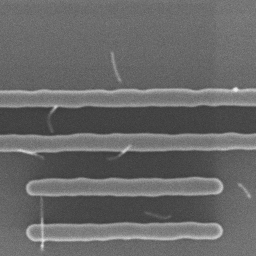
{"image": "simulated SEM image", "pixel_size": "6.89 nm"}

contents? groups of lines, slits or small figures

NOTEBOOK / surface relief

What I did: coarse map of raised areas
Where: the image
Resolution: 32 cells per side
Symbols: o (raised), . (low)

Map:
................................
................................
................................
................................
................................
................................
................................
................................
................................
................................
................................
oooooooooooooooooooooooooooooooo
oooooooooooooooooooooooooooooooo
......o.........................
................................
................................
................................
oooooooooooooooooooooooooooooooo
oooooooooooooooooooooooooooooooo
................................
................................
................................
.....ooooooo.oooooooooooooo.....
...ooooooooooooooooooooooooo....
......oo......ooo.oo............
................................
................................
................................
....oooooooooooooooooooooooo....
...oooooooooooooooooooooooo.....
................................
................................